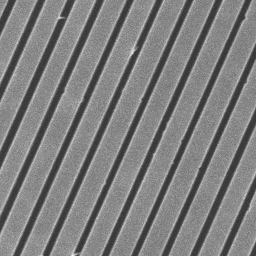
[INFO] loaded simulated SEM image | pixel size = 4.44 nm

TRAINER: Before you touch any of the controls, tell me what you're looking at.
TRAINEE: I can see parallel lines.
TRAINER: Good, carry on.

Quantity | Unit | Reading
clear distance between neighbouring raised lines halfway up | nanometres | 29.9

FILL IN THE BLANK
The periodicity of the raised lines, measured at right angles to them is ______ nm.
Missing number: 120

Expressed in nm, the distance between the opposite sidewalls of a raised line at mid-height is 89.3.